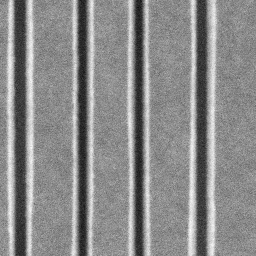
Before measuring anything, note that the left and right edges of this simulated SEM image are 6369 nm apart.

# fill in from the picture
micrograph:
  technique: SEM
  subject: lines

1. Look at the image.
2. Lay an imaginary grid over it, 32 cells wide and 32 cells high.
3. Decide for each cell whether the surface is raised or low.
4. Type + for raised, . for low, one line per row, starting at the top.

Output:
+...+++++..+++++..++++++..++++++
+...+++++..+++++..++++++..++++++
+...+++++..+++++..++++++..++++++
+...+++++..+++++..++++++..++++++
+...+++++..+++++..++++++..++++++
+...+++++..+++++..++++++..++++++
+...+++++..+++++..++++++..++++++
+...+++++..+++++..++++++..++++++
+...+++++..+++++..++++++..++++++
+...+++++..+++++..++++++..++++++
+...+++++..+++++..++++++..++++++
+...+++++..+++++..++++++..++++++
+...+++++..+++++..++++++..++++++
+...+++++..+++++..++++++..++++++
+...+++++..+++++..++++++..++++++
+...+++++..+++++..++++++..++++++
+...+++++..+++++..++++++..++++++
+...+++++..+++++..++++++..++++++
+...+++++..+++++..++++++..++++++
+...+++++..++++++.++++++..++++++
+...+++++..++++++.++++++..++++++
+...+++++..++++++.++++++..++++++
+...+++++..++++++.++++++..++++++
+...+++++..++++++.++++++..++++++
+...+++++..++++++.++++++..++++++
+...+++++..++++++.++++++..++++++
+...+++++..++++++.++++++..++++++
+...+++++..+++++..++++++..++++++
+...+++++..+++++..++++++..++++++
++..+++++..+++++..++++++..++++++
++..+++++..+++++..++++++..++++++
++..+++++..+++++..++++++..++++++